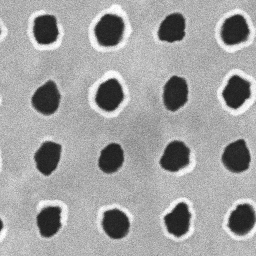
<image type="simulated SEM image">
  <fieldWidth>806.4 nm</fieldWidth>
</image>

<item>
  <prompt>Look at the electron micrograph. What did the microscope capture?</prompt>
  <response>a regular array of holes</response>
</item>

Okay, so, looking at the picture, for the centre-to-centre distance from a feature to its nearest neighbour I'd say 0.197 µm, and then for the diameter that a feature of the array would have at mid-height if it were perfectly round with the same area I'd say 88.7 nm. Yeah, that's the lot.